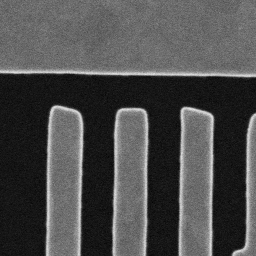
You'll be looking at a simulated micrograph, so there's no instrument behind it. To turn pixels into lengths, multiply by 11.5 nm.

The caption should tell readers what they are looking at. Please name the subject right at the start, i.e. wiring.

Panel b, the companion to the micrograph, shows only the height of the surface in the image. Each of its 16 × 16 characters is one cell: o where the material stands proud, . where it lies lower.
oooooooooooooooo
oooooooooooooooo
oooooooooooooooo
oooooooooooooooo
oooooooooooooooo
................
................
...oo..oo..oo...
...oo..oo..oo..o
...oo..oo..oo..o
...oo..oo..oo..o
...oo..oo..oo..o
...oo..oo..oo..o
...oo..oo..oo..o
...oo..oo..oo..o
...oo..oo..oo..o